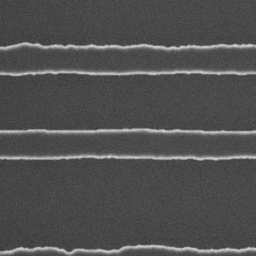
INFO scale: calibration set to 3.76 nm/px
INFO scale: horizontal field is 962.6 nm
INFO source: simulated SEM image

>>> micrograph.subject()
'lines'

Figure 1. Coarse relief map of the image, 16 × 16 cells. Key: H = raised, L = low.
LLLLLLLLLLLLLLLL
LLLLLLLLLLLLLLLL
LLLLLLLLLLLLLLLL
HHHHHHHHHHHHHHHH
HHHHHHHHHHHHHHHH
LLLLLLLLLLLLLLLL
LLLLLLLLLLLLLLLL
LLLLLLLLLLLLLLLL
HHHHHHHHHHHHHHHH
HHHHHHHHHHHHHHHH
LLLLLLLLLLLLLLLL
LLLLLLLLLLLLLLLL
LLLLLLLLLLLLLLLL
LLLLLLLLLLLLLLLL
LLLLLLLLLLLLLLLL
LLHLLLLLHHHLLLLL